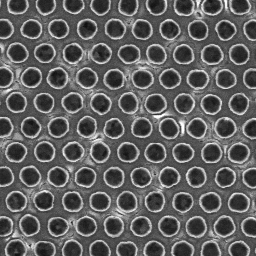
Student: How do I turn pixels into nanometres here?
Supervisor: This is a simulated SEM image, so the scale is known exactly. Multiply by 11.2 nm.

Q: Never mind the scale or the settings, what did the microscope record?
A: a regular array of raised bodies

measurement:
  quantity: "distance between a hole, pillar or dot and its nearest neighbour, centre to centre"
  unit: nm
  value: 306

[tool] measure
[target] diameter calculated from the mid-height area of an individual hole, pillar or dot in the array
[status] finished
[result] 219 nanometers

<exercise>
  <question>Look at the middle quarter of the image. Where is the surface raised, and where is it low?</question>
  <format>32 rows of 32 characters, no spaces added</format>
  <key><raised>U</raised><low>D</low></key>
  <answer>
DDDDDDDDDDDDDDDDDDDDDDDDDDDDDDDD
DDDDUUUDDDDDDDDDDDDDDDDDDDUDDDDD
UDDUUUUUDDDUUUUDDUUUUUDDUUUUDDDU
UDDUUUUUDDUUUUUDDUUUUUDDUUUUUDDU
UDDUUUUUDDUUUUUDDUUUUUDDUUUUUDDU
DDDDUUUDDDDUUUUDDDUUUDDDDUUUDDDD
DDDDDDDDDDDDDDDDDDDDDDDDDDDDDDDD
DUUDDDDDUUDDDDDUUDDDDDDDDDDDDDDD
UUUUDDDUUUUDDDUUUUDDDUUUUDDDUUUU
UUUUDDDUUUUUDDUUUUDDDUUUUDDDUUUU
UUUUDDDUUUUUDDUUUUDDUUUUUDDDUUUU
DUUUDDDDUUUDDDDUUUDDDUUUUDDDUUUU
DDDDDDDDDDDDDDDDDDDDDDDDDDDDDDDD
DDDDDUUDDDDDDDDDDDDDDDDDDDDDDDDD
UDDDUUUUDDDUUUDDDDUUUDDDUUUUDDDD
UDDUUUUUDDUUUUUDDUUUUUDDUUUUDDDU
UDDUUUUUDDUUUUUDDUUUUUDDUUUUUDDU
DDDDUUUDDDUUUUUDDUUUUDDDDUUUDDDU
DDDDDDDDDDDDUDDDDDDDDDDDDDDDDDDD
DDDDDDDDDDDDDDDDDDDDDDDDDDDDDDDD
UUUUDDDUUUUDDDUUUUDDDUUUUDDDUUUD
UUUUUDDUUUUDDDUUUUDDUUUUUDDUUUUU
UUUUUDDUUUUDDDUUUUDDUUUUUDDUUUUU
DUUUDDDUUUUDDDUUUUDDDUUUUDDDUUUU
DDDDDDDDUUDDDDDDDDDDDDDDDDDDDDDD
DDDDDDDDDDDDDDDDDDDDDDDDDDDDDDDD
DDDDUUUDDDDUUUDDDDUUDDDDDUUUDDDU
UDDUUUUUDDUUUUUDDUUUUDDDUUUUUDDU
UDDUUUUUDDUUUUUDDUUUUUDDUUUUUDDU
UDDUUUUDDDDUUUUDDUUUUDDDUUUUDDDU
DDDDDDDDDDDUUUDDDDUUDDDDDUUDDDDD
DDDDDDDDDDDDDDDDDDDDDDDDDDDDDDDD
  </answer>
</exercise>